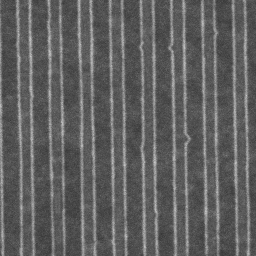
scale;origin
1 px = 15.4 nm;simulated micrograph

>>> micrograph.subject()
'parallel lines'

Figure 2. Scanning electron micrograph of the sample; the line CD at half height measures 306 nanometres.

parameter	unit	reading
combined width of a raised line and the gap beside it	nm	474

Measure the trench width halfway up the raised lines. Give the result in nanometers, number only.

172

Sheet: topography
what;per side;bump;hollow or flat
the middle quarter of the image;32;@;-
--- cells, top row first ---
@@@@---@@@@@---@@@@@--@@@@@---@@
@@@@---@@@@@---@@@@@--@@@@@---@@
@@@@---@@@@@---@@@@@--@@@@@---@@
@@@@---@@@@@---@@@@@---@@@@---@@
@@@@---@@@@@---@@@@@---@@@@---@@
@@@@---@@@@@---@@@@@---@@@@---@@
@@@@---@@@@@---@@@@@---@@@@---@@
@@@@---@@@@@---@@@@@---@@@@---@@
@@@@---@@@@@---@@@@@---@@@@---@@
@@@@---@@@@@---@@@@@---@@@@---@@
@@@@---@@@@@---@@@@@---@@@@---@@
@@@@@--@@@@@---@@@@@---@@@@---@@
@@@@@--@@@@@---@@@@@---@@@@---@@
@@@@@--@@@@@---@@@@@---@@@@---@@
@@@@@--@@@@@---@@@@@---@@@@---@@
@@@@---@@@@@---@@@@@---@@@@---@@
@@@@---@@@@@---@@@@@---@@@@---@@
@@@@---@@@@@---@@@@@---@@@@---@@
@@@@---@@@@@---@@@@@---@@@@----@
@@@@---@@@@@---@@@@@---@@@@----@
@@@@---@@@@@---@@@@@---@@@@@---@
@@@@---@@@@@---@@@@@---@@@@@--@@
@@@@----@@@@---@@@@@---@@@@@--@@
@@@@----@@@@---@@@@@---@@@@@--@@
@@@@@---@@@@---@@@@@---@@@@@--@@
@@@@@---@@@@---@@@@@---@@@@@--@@
@@@@@---@@@@---@@@@@---@@@@@---@
@@@@@---@@@@---@@@@@---@@@@@--@@
@@@@----@@@@---@@@@@---@@@@@--@@
@@@@----@@@@---@@@@@---@@@@@--@@
@@@@----@@@@---@@@@@---@@@@@--@@
@@@@----@@@@---@@@@@---@@@@@---@